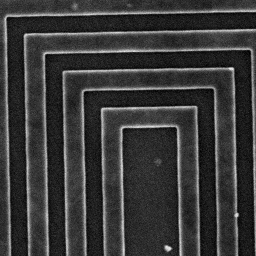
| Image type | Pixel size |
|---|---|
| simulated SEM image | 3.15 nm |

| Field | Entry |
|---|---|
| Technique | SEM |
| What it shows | groups of lines, slits or small figures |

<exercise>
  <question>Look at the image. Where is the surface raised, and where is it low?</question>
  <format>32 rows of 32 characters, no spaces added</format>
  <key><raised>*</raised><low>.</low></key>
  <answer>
********************************
*************************.......
*...............................
*...............................
*..*****************************
*..*****************************
*..***********.................*
*..***.........................*
*..***.....................**...
*..***..*********************...
*..***..*********************...
*..***..***................**...
*..***..**.................**...
*..***..**.....*********...**...
*..***..**...************..**...
*..***..**...************..**...
*..***..**...**.......***..**...
*..***..**...**.......***..**...
*..***..***..**.......***..**...
*..***..***..**.......***..**...
*..***..***..**.......***..**...
*..***..***..**.......***..***..
*..***..***..**.......***..***..
*..***..***..**.......***..***..
*..***..***..**.......***..***..
*...**..***..**.......***..***..
*...**..***..**.......***..***..
*...**..***..**.......***..***..
*...**..***..**.......***..***..
*...**..***..***.......**..***..
*...**..***..***.......**..***..
*...**..***..***.......**..***..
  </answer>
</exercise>